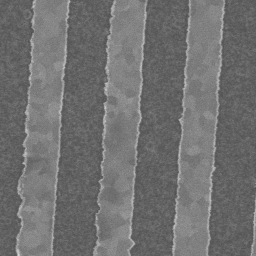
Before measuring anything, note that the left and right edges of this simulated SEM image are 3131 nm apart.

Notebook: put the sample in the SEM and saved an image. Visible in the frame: one or a few lines or trenches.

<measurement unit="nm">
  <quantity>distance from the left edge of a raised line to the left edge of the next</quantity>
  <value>949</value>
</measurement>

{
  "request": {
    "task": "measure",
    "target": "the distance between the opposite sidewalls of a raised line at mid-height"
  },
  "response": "420 nm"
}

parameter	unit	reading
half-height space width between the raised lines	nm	526